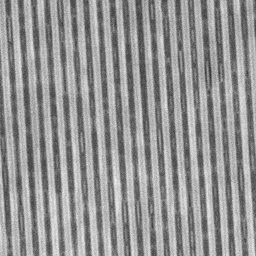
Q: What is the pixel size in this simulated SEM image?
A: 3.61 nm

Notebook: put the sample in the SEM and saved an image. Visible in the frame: parallel lines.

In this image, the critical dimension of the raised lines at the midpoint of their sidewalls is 22.5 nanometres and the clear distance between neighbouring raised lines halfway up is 0.0257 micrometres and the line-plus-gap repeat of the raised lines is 47.1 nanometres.